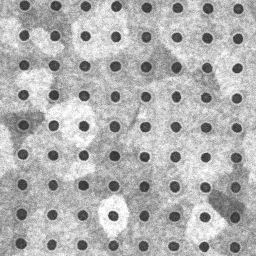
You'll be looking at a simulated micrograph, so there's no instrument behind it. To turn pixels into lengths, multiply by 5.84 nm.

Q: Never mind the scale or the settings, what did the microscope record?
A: a regular array of holes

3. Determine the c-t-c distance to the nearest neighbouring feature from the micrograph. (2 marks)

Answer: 173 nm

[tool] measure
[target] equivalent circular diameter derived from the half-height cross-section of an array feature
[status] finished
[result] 65.9 nanometres